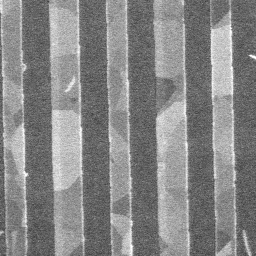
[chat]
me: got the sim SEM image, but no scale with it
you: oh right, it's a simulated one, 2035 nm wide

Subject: lines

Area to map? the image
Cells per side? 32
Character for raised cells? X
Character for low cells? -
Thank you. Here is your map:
XXX----XXX---XXX----XXX---XXX---
XXX----XXX---XXX----XXX---XXX---
XXX----XXX---XXX----XXX---XXX---
XXX----XXX---XXX----XXX---XXX---
XXX----XXX---XXX----XXX---XXX---
XXX----XXX---XXX----XXX---XXX---
XXX----XXX---XXX----XXX---XXX---
XXX----XXX----XX----XXX---XXX---
XXX----XXX---XXX----XXX----XX---
XXX----XXX---XXX----XXX----XX---
XXX----XXX---XXX----XXX----XX---
XXX----XXX----XX----XXX----XX---
XXX----XXX----XX----XXX----XX---
XXX----XXX----XX----XXX----XX---
XXX----XXX----XX----XXX----XX---
XXX----XXX----XX----XXX----XX---
-XX----XXX----XX----XXX----XX---
-XX----XXX----XX----XXX----XX---
-XX----XXX----XX----XXX----XX---
-XX----XXX----XX----XXX----XX---
-XX----XXX----XX----XXX----XX---
-XX----XXX----XX----XXX----XX---
-XX----XXX----XX----XXX----XX---
-XX----XXX----XX----XXX----XX---
-XX----XXX----XX----XXX----XX---
-XX----XXX----XX----XXX----XX---
-XX----XXX----XX----XXX----XX---
-XX----XXX----XX----XXX----XX---
-XX----XXX----XX----XXX----XX---
-XX----XXX----XX----XXX----XX---
-XX----XXX----XX----XXXX---XX---
-XX----XXX----XX----XXXX---XX---